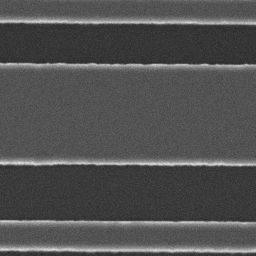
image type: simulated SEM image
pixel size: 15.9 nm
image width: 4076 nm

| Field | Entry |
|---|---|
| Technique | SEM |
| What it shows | lines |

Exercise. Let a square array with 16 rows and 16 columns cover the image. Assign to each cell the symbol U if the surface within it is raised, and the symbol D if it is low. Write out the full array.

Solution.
UUUUUUUUUUUUUUUU
DDDDDDDDDDDDDDDD
DDDDDDDDDDDDDDDD
DDDDDDDDDDDDDDDD
UUUUUUUUUUUUUUUU
UUUUUUUUUUUUUUUU
UUUUUUUUUUUUUUUU
UUUUUUUUUUUUUUUU
UUUUUUUUUUUUUUUU
UUUUUUUUUUUUUUUU
DDDDDDDDDDDDDDDD
DDDDDDDDDDDDDDDD
DDDDDDDDDDDDDDDD
DDDDDDDDDDDDDDDD
UUUUUUUUUUUUUUUU
UUUUUUUUUUUUUUUU